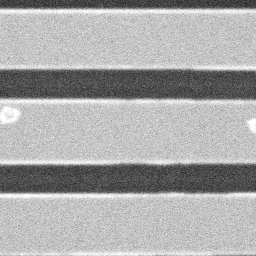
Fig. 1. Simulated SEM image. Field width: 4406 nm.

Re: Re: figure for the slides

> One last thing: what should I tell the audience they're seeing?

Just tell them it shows lines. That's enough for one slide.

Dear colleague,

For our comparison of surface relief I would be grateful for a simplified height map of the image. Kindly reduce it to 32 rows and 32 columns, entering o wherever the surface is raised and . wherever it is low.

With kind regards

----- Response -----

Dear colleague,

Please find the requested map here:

................................
oooooooooooooooooooooooooooooooo
oooooooooooooooooooooooooooooooo
oooooooooooooooooooooooooooooooo
oooooooooooooooooooooooooooooooo
oooooooooooooooooooooooooooooooo
oooooooooooooooooooooooooooooooo
oooooooooooooooooooooooooooooooo
........................oooooooo
................................
................................
................................
................................
oooooooooooooooooooooooooooooooo
oooooooooooooooooooooooooooooooo
oooooooooooooooooooooooooooooooo
oooooooooooooooooooooooooooooooo
oooooooooooooooooooooooooooooooo
oooooooooooooooooooooooooooooooo
oooooooooooooooooooooooooooooooo
................................
................................
................................
................................
oooooooooooooooooooooooooooooooo
oooooooooooooooooooooooooooooooo
oooooooooooooooooooooooooooooooo
oooooooooooooooooooooooooooooooo
oooooooooooooooooooooooooooooooo
oooooooooooooooooooooooooooooooo
oooooooooooooooooooooooooooooooo
oooooooooooooooooooooooooooooooo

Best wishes